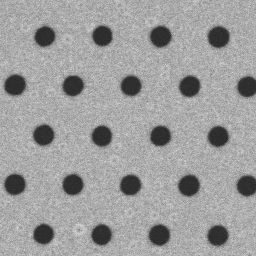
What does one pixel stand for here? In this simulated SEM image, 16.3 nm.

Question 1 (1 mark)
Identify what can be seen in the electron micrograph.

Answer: a regular array of holes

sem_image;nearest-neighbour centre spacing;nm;933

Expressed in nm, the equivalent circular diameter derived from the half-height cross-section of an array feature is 342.